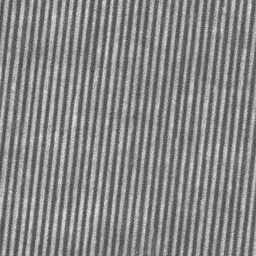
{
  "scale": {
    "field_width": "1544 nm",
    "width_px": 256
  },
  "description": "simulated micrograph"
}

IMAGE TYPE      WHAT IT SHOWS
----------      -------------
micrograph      parallel lines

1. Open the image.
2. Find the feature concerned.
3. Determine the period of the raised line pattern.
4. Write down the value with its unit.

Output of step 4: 48.5 nm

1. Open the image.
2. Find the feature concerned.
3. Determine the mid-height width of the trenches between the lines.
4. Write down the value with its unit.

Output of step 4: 29.9 nm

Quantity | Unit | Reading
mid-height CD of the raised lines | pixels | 2.85